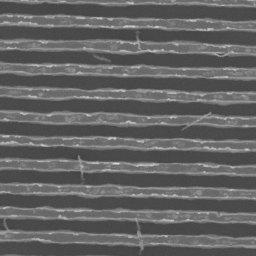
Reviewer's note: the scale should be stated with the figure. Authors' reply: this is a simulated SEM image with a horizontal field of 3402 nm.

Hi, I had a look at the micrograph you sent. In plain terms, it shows parallel lines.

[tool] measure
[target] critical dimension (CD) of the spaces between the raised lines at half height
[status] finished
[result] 181 nm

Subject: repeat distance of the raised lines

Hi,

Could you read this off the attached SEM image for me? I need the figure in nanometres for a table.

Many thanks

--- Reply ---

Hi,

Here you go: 319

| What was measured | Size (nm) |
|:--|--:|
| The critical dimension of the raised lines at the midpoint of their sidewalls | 133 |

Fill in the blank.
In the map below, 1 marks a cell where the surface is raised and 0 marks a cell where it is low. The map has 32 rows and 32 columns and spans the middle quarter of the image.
11111110110110000011100000000000
11111111111111111111111111111111
11111011111111111111111111111111
00000000000000000000000000000000
00000000000000000000000000000000
00000000000000000000000000000000
11110001110110111111110000000000
11111111111111111111111111111111
11000000111111111111111111111111
00000000000000000000000000000000
00000000000000000000000000000000
00000000000000000000000000000000
11111001111111000000000000000000
11111111111111111111111111111111
11111111111111111111111111111111
00000000000000000000000000000000
00000000000000000000000000000000
00000000000000000000000000000000
00111111111111000000000000000000
11111111111111111111111111111111
11111111111111111111111111111111
00000000000000000000000000000110
00000000000000000000000000000000
00000000000000000000000000000000
11111101110000000000000000000000
11111111111111111111111111111111
11111111111111111111111111111111
00000000000000000000000000000001
00000000000000000000000000000000
00000000000000000000000000000000
11110000111111000000000000000000
11111111111111111111111111111111